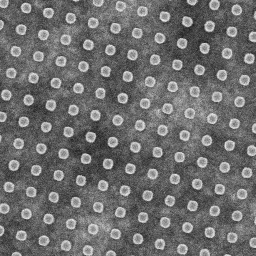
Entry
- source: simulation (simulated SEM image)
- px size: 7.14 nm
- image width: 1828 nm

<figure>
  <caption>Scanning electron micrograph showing a regular array of raised bodies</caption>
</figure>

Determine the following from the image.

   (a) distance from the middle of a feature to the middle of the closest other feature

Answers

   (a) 159 nanometres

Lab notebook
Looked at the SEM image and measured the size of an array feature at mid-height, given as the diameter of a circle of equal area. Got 73.9 nm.